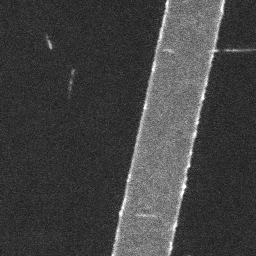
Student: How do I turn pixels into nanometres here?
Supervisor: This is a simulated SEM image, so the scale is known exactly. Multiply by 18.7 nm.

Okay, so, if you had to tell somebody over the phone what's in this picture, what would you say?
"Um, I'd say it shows one or a few lines or trenches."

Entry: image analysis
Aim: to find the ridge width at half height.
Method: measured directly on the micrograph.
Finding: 1040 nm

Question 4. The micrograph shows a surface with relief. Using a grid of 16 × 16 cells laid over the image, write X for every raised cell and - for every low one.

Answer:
----------XXXX--
----------XXXX--
----------XXX---
----------XXX---
----------XXX---
---------XXXX---
---------XXXX---
---------XXX----
---------XXX----
--------XXXX----
--------XXXX----
--------XXXX----
--------XXX-----
-------XXXX-----
-------XXXX-----
-------XXXX-----